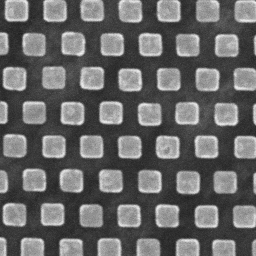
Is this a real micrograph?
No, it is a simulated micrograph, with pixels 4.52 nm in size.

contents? a regular array of raised bodies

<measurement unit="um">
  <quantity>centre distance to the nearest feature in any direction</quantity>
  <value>0.172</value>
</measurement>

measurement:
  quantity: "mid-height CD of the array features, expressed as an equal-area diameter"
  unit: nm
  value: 109